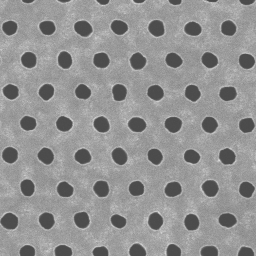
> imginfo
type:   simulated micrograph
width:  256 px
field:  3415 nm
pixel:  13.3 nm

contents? a regular array of holes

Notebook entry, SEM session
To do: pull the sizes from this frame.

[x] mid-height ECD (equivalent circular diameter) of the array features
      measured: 0.208 um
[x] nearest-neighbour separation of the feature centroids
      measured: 478 nm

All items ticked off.